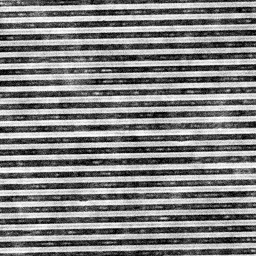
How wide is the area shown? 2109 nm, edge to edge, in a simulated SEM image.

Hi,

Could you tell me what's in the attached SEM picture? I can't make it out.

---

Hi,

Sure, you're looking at parallel lines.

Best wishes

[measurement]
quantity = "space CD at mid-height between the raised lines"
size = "0.0535 µm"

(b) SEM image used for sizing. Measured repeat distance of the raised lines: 94.6 nanometres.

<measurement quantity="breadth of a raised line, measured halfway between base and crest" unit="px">4.62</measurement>